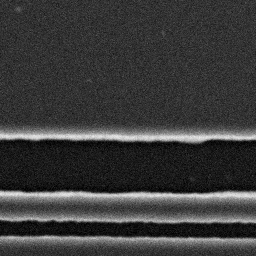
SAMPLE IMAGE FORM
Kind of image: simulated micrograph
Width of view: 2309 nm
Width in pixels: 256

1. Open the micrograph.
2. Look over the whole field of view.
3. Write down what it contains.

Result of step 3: lines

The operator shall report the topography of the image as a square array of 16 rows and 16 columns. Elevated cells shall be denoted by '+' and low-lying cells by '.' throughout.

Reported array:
++++++++++++++++
++++++++++++++++
++++++++++++++++
++++++++++++++++
++++++++++++++++
++++++++++++++++
++++++++++++++++
++++++++++++++++
++++++++++++++++
................
................
................
++++++++++++++++
++++++++++++++++
++++++++++++++++
++++++++++++++++